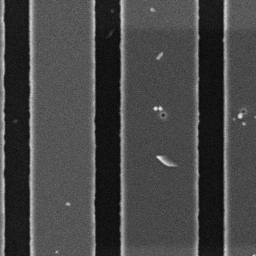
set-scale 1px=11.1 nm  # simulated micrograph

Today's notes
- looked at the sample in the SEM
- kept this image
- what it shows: lines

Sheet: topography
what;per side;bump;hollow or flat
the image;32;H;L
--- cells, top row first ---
HLLLHHHHHHHHLLLHHHHHHHHHHLLLHHHH
HLLLHHHHHHHHLLLHHHHHHHHHHLLLHHHH
HLLLHHHHHHHHLLLHHHHHHHHHHLLLHHHH
HLLLHHHHHHHHLLLHHHHHHHHHHLLLHHHH
HLLLHHHHHHHHLLLHHHHHHHHHHLLLHHHH
HLLLHHHHHHHHLLLHHHHHHHHHHLLLHHHH
HLLLHHHHHHHHLLLHHHHHHHHHHLLLHHHH
HLLLHHHHHHHHLLLHHHHHHHHHHLLLHHHH
HLLLHHHHHHHHLLLHHHHHHHHHHLLLHHHH
HLLLHHHHHHHHLLLHHHHHHHHHHLLLHHHH
HLLLHHHHHHHHLLLHHHHHHHHHHLLLHHHH
HLLLHHHHHHHHLLLHHHHHHHHHHLLLHHHH
HLLLHHHHHHHHLLLHHHHHHHHHHLLLHHHH
HLLLHHHHHHHHLLLHHHHHHHHHHLLLHHHH
HLLLHHHHHHHHLLLHHHHHHHHHHLLLHHHH
HLLLHHHHHHHHLLLHHHHHHHHHHLLLHHHH
HLLLHHHHHHHHLLLHHHHHHHHHHLLLHHHH
HLLLHHHHHHHHLLLHHHHHHHHHHLLLHHHH
HLLLHHHHHHHHLLLHHHHHHHHHHLLLHHHH
HLLLHHHHHHHHLLLHHHHHHHHHHLLLHHHH
HLLLHHHHHHHHLLLHHHHHHHHHHLLLHHHH
LLLLHHHHHHHHLLLHHHHHHHHHHLLLHHHH
HLLLHHHHHHHHLLLHHHHHHHHHHLLLHHHH
HLLLHHHHHHHHLLLHHHHHHHHHHLLLHHHH
HLLLHHHHHHHHLLLHHHHHHHHHHLLLHHHH
HLLLHHHHHHHHLLLHHHHHHHHHHLLLHHHH
HLLLHHHHHHHHLLLHHHHHHHHHHLLLHHHH
HLLLHHHHHHHHLLLHHHHHHHHHHLLLHHHH
HLLLHHHHHHHHLLLHHHHHHHHHHLLLHHHH
HLLLHHHHHHHHLLLHHHHHHHHHHLLLHHHH
HLLLHHHHHHHHLLLHHHHHHHHHHLLLHHHH
HLLLHHHHHHHHLLLHHHHHHHHHHLLLHHHH